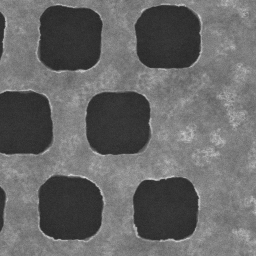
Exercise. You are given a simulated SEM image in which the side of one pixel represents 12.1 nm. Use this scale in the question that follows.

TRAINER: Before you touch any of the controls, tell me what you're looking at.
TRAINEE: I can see holes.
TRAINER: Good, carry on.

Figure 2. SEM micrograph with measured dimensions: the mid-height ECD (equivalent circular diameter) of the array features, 0.824 µm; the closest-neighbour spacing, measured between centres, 97.4 pixels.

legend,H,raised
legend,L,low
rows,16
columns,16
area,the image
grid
HHHLLHHHHLLLHHHH
HHHLLLHHLLLLHHHH
HHHLLLHHLLLLLHHH
HHLLLLHHHLLLHHHH
HHHHHHHHHHHHHHHH
HHHHHHHHHHHHHHHH
LLLHHHLLLHHHHHHH
LLLHHLLLLHHHHHHH
LLLHHLLLLHHHHHHH
LLLHHHLLLHHHHHHH
HHHHHHHHHHHHHHHH
HHHLLLHHHLLLHHHH
HHLLLLHHLLLLHHHH
HHLLLLHHLLLLHHHH
HHHLLLHHHLLLHHHH
HHHHHHHHHHHHHHHH